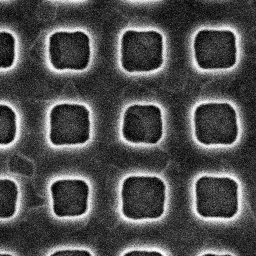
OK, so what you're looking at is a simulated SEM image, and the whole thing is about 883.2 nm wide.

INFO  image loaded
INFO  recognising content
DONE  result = a regular array of holes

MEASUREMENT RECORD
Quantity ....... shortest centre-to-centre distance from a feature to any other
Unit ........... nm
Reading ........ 250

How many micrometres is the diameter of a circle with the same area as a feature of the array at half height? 0.155